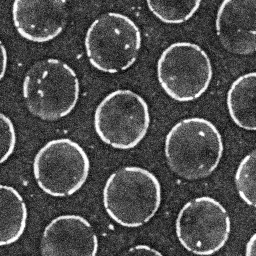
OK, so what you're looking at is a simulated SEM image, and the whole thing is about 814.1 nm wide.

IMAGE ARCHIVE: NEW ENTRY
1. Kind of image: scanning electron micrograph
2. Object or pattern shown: a regular array of raised bodies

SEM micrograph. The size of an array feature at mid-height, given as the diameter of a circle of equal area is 176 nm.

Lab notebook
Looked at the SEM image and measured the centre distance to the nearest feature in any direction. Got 77 pixels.